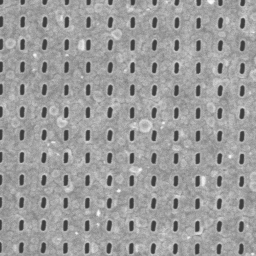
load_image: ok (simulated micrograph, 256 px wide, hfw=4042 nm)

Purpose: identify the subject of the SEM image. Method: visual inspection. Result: a regular array of holes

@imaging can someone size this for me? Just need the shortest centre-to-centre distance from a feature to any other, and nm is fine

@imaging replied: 344